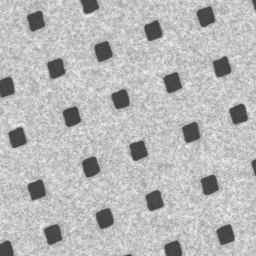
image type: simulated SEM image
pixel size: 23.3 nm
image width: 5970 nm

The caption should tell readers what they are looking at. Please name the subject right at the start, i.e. a regular array of holes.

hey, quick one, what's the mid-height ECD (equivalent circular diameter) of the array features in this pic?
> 445 nanometers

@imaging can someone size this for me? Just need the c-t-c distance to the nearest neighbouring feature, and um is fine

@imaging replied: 1.19